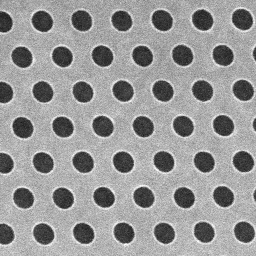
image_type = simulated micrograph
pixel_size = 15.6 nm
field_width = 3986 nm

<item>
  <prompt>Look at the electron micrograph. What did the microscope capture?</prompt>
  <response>a regular array of holes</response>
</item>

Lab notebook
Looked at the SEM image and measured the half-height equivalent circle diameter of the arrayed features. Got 342 nanometers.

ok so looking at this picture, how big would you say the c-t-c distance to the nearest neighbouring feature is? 622 nm